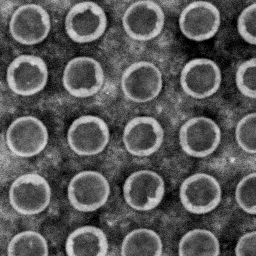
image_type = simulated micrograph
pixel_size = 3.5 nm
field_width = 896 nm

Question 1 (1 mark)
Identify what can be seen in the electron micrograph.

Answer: a regular array of raised bodies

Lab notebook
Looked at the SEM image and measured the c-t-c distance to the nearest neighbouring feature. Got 0.193 micrometres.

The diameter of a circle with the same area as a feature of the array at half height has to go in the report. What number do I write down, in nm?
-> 134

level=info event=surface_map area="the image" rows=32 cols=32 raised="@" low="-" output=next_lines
----------@------@@-----@@------
--@@@@---@@@@---@@@@---@@@@----@
--@@@@--@@@@@---@@@@---@@@@---@@
-@@@@@--@@@@@---@@@@---@@@@---@@
--@@@@---@@@-----@@----@@@-----@
--------------------------------
--------------------------------
--@@@----@@---------------------
-@@@@@--@@@@----@@@----@@@@---@@
-@@@@@--@@@@@---@@@@---@@@@---@@
-@@@@---@@@@@--@@@@@---@@@@---@@
--@@-----@@@----@@@@---@@@@----@
-----------------@--------------
--------------------------------
-------------------------------@
--@@@----@@@@---@@@@---@@@@---@@
-@@@@@---@@@@---@@@@---@@@@---@@
-@@@@@---@@@@---@@@@---@@@@---@@
-@@@@----@@@@---@@@@---@@@@----@
--------------------------------
--------------------------------
--------------------------------
--@@@----@@@@---@@@@---@@@@---@@
--@@@@---@@@@---@@@@---@@@@---@@
-@@@@@---@@@@---@@@@---@@@@---@@
--@@@@---@@@@---@@@@---@@@@---@@
---@--------------------@-------
--------------------------------
--------------------------------
--@@@----@@@@---@@@----@@@@----@
-@@@@@--@@@@@--@@@@@---@@@@---@@
-@@@@@---@@@@--@@@@@---@@@@---@@